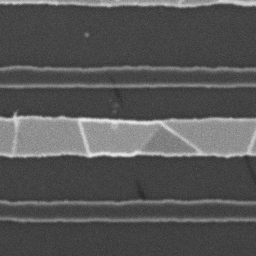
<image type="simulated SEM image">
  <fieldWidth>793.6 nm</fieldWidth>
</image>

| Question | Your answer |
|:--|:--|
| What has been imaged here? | lines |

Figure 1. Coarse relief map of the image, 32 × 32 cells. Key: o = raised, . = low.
.......oooooooooooooooooooo..ooo
................................
................................
................................
................................
................................
................................
................................
ooooo........ooooooooo..o.......
oooooooooooooooooooooooooooooooo
oooooooooooooooooooooooooooooooo
................................
................................
................................
................................
oooooooooooooooooooooooooooooooo
oooooooooooooooooooooooooooooooo
oooooooooooooooooooooooooooooooo
oooooooooooooooooooooooooooooooo
.o.oo.......................o...
................................
................................
................................
................................
................................
oooooooooooooooooooooooooooooooo
oooooooooooooooooooooooooooooooo
.ooooooooooooooooooooooooooooooo
................................
................................
................................
................................